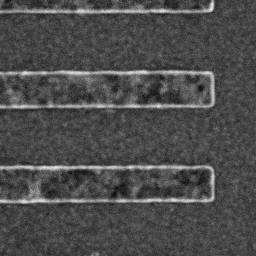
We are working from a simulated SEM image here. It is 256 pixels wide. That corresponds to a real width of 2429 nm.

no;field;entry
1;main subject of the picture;wiring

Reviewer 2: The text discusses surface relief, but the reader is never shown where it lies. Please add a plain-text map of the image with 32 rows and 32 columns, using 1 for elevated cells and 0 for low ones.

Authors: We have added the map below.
11111111111111111111111111100000
00000000000000000000000000000000
00000000000000000000000000000000
00000000000000000000000000000000
00000000000000000000000000000000
00000000000000000000000000000000
00000000000000000000000000000000
00000000000000000000000000000000
00000000000000000000000000000000
11111111111111111111111111100000
11111111111111111111111111100000
11111111111111111111111111100000
11111111111111111111111111100000
00000000000000000000000000000000
00000000000000000000000000000000
00000000000000000000000000000000
00000000000000000000000000000000
00000000000000000000000000000000
00000000000000000000000000000000
00000000000000000000000000000000
00000000000000000000000000000000
11111111111111111111111111100000
11111111111111111111111111100000
11111111111111111111111111100000
11111111111111111111111111100000
00000000000000000000000000000000
00000000000000000000000000000000
00000000000000000000000000000000
00000000000000000000000000000000
00000000000000000000000000000000
00000000000000000000000000000000
00000000000000000000000000000000